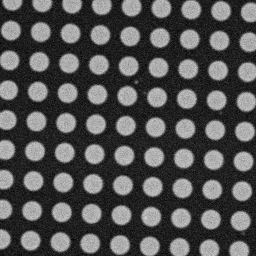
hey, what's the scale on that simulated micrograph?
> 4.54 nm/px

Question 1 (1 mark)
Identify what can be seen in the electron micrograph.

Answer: an array of small figures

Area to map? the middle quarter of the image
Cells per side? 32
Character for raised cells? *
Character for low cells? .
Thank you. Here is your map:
***...*****...****...*****...***
***....****...****...*****...***
...............**.....***....***
...............................*
................................
**......*.......................
***...****....***.....***.......
***...*****...****...****....***
***...*****...****...*****...***
.......***....****...****...****
......................**.....***
................................
*...............................
**....****....***...............
***...****...*****...****....***
***...****...*****...****...****
**....****...*****...****...****
..............***....****...****
................................
................................
**....***.......................
**....****...****....***.....**.
**...*****...****...*****...****
**....****...****...*****...****
.......**....****....***....****
......................*......**.
................................
*...............................
**....***....***................
**...****....****...****....***.
**...****...*****...****...*****
*.....***....****...****...*****